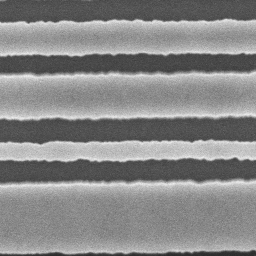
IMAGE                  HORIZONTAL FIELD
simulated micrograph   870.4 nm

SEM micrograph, lines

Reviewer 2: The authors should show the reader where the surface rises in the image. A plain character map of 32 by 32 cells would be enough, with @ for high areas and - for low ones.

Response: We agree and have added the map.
--------------------------------
--------------------------------
----------------------------@---
@@@@@@@@@@@@@@@@@@@@@@@@@@@@@@@@
@@@@@@@@@@@@@@@@@@@@@@@@@@@@@@@@
@@@@@@@@@@@@@@@@@@@@@@@@@@@@@@@@
@@@@@@@@@@@@@@@@@@@@@@@@@@@@@@@@
--------------------------------
--------------------------------
@@@@@@@@@@@@@@@@@@@@@@@@@@@@@@@@
@@@@@@@@@@@@@@@@@@@@@@@@@@@@@@@@
@@@@@@@@@@@@@@@@@@@@@@@@@@@@@@@@
@@@@@@@@@@@@@@@@@@@@@@@@@@@@@@@@
@@@@@@@@@@@@@@@@@@@@@@@@@@@@@@@@
@@@@@@@@@@@@@@@@@@@@@@@-@@@@----
--------------------------------
--------------------------------
--------------------------------
@@@@@@@@@@@@@@@@@@@@@@@@@@@@@@@@
@@@@@@@@@@@@@@@@@@@@@@@@@@@@@@@@
--------------------------------
--------------------------------
--------------------------------
@@@@@@@@@@@@@@@@@@@@@@@@@@@@@@@@
@@@@@@@@@@@@@@@@@@@@@@@@@@@@@@@@
@@@@@@@@@@@@@@@@@@@@@@@@@@@@@@@@
@@@@@@@@@@@@@@@@@@@@@@@@@@@@@@@@
@@@@@@@@@@@@@@@@@@@@@@@@@@@@@@@@
@@@@@@@@@@@@@@@@@@@@@@@@@@@@@@@@
@@@@@@@@@@@@@@@@@@@@@@@@@@@@@@@@
@@@@@@@@@@@@@@@@@@@@@@@@@@@@@@@@
@@@@@@-@@@@@@@@@@@@@@-@---------